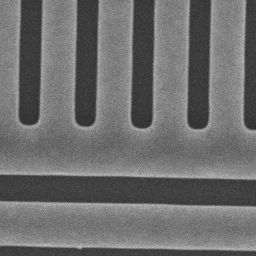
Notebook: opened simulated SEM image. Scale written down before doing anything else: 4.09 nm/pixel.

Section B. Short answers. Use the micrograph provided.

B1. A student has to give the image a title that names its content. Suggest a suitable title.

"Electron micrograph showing groups of lines, slits or small figures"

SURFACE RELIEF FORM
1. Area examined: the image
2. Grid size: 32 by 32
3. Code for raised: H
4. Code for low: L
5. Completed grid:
HHHLLHHHHHLLHHHHHLLHHHHHLLHHHHHL
HHHLLHHHHHLLHHHHHLLHHHHHLLHHHHHL
HHLLLHHHHHLLHHHHHLLHHHHHLLHHHHHL
HHLLLHHHHLLLHHHHLLLHHHHHLLHHHHHL
HHLLLHHHHLLLHHHHLLLHHHHHLLHHHHHL
HHLLLHHHHLLLHHHHLLLHHHHHLLHHHHHL
HHLLLHHHHLLLHHHHLLLHHHHHLLHHHHLL
HHLLLHHHHLLLHHHHLLLHHHHHLLHHHHLL
HHLLLHHHHLLLHHHHLLLHHHHHLLHHHHLL
HHLLLHHHHLLLHHHHLLLHHHHLLLHHHHLL
HHLLLHHHHLLLHHHHLLLHHHHLLLHHHHLL
HHLLLHHHHLLLHHHHLLLHHHHLLLHHHHLL
HHLLLHHHHLLLHHHHLLLHHHHLLLHHHHLL
HHLLLHHHHLLLHHHHLLLHHHHLLLHHHHLL
HHLLLHHHHLLLHHHHLLLHHHHLLLHHHHLL
HHHLHHHHHHLLHHHHHLLHHHHHLLHHHHHL
HHHHHHHHHHHHHHHHHHHHHHHHHHHHHHHH
HHHHHHHHHHHHHHHHHHHHHHHHHHHHHHHH
HHHHHHHHHHHHHHHHHHHHHHHHHHHHHHHH
HHHHHHHHHHHHHHHHHHHHHHHHHHHHHHHH
HHHHHHHHHHHHHHHHHHHHHHHHHHHHHHHH
HHHHHHHHHHHHHHHHHHHHHHHHHHHHHHHH
LLLLLLLLLLLLLLLLLLLLLLLLLLLLLLLL
LLLLLLLLLLLLLLLLLLLLLLLLLLLLLLLL
LLLLLLLLLLLLLLLLLLLLLLLLLLLLLLLL
HHHHHHHHHHHHHHLLLLLLLLLLLLLLLLLL
HHHHHHHHHHHHHHHHHHHHHHHHHHHHHHHH
HHHHHHHHHHHHHHHHHHHHHHHHHHHHHHHH
HHHHHHHHHHHHHHHHHHHHHHHHHHHHHHHH
HHHHHHHHHHHHHHHHHHHHHHHHHHHHHHHH
HHHHHHHHHHHHHHHHHHHHHHHHHHHHHHHH
LLLLLLLLLLLLLLLLLLLLLLLLLLLLLLLL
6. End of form